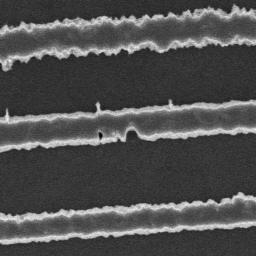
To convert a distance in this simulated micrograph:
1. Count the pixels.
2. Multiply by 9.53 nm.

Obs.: one or a few lines or trenches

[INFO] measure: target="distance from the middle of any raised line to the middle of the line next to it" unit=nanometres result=885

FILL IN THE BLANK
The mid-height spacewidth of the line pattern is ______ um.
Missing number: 0.622